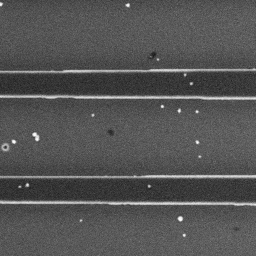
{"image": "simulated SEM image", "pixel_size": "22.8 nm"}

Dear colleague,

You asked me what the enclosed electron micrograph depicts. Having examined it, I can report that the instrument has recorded lines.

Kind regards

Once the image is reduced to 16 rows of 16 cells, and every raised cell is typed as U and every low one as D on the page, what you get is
DDDDDDDDDDDDDDDD
DDDDDDDDDDDDDDDD
DDDDDDDDDDDDDDDD
DDDDDDDDDDDDDDDD
UUUUUUUUUUUUUUUU
UUUUUUUUUUUUUUUU
DDDDDDDDDDDDDDDD
DDDDDDDDDDDDDDDD
DDDDDDDDDDDDDDDD
DDDDDDDDDDDDDDDD
DDDDDDDDDDDDDDDD
UUUUUUUUUUUUUUUU
UUUUUUUUUUUUUUUU
DDDDDDDDDDDDDDDD
DDDDDDDDDDDDDDDD
DDDDDDDDDDDDDDDD